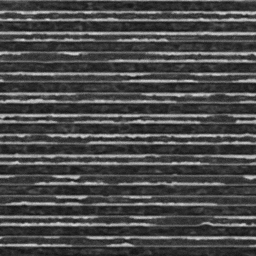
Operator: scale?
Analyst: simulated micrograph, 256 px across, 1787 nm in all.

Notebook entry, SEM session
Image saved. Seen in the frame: parallel lines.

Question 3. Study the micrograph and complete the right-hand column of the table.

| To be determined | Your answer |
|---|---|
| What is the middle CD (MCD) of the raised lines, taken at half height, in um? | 0.0707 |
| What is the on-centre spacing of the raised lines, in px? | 20.5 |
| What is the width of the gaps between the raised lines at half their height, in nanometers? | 76.8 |